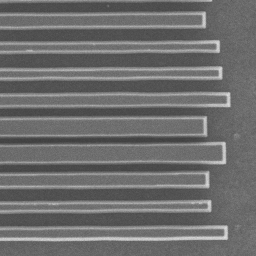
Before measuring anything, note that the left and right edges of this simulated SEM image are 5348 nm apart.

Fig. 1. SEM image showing groups of lines, slits or small figures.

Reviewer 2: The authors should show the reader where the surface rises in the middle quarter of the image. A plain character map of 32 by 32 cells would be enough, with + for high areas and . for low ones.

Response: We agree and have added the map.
................................
++++++++++++++++++++++++++++++++
++++++++++++++++++++++++++++++++
++++++++++++++++++++++++++++++++
................................
................................
................................
................................
++++++++++++++++++++++++++++++++
++++++++++++++++++++++++++++++++
++++++++++++++++++++++........+.
................................
................................
++++++++++++++++++++++++++++++++
++++++++++++++++++++++++++++++++
++++++++++++++++++++++++++++++++
++++++++++++++++++++++++++++++++
++++++++++++++++++++++++++++++++
................................
................................
++++++++++++++++++++++++++++++++
++++++++++++++++++++++++++++++++
++++++++++++++++++++++++++++++++
++++++++++++++++++++++++++++++++
++++++++++++++++++........++++++
................................
................................
.+++++++++++++++++++++++++++++++
++++++++++++++++++++++++++++++++
++++++++++++++++++++++++++++++++
++++++++++++++++++++++++++++++++
................................